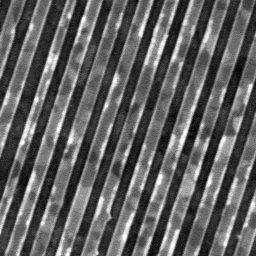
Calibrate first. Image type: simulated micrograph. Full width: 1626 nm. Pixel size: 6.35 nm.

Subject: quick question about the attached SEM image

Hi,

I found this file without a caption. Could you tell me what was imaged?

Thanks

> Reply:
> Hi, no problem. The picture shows parallel lines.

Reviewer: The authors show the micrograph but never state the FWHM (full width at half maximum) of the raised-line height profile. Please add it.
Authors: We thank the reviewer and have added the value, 81.4 nanometers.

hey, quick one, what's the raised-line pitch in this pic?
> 0.153 micrometres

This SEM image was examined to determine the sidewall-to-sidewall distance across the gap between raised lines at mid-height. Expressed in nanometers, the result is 70.8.